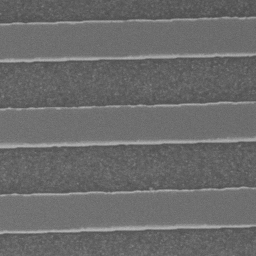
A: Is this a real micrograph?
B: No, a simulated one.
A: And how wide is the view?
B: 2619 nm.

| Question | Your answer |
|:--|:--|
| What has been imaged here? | lines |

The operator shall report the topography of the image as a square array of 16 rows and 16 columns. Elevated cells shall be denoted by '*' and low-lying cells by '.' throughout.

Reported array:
................
****************
****************
**************..
................
................
.............***
****************
****************
................
................
................
****************
****************
***.............
................